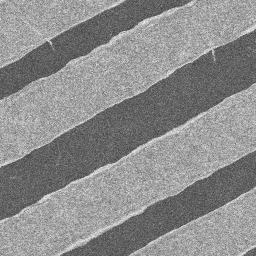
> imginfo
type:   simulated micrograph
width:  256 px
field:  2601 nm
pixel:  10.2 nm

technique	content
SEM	one or a few lines or trenches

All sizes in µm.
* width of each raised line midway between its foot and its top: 0.576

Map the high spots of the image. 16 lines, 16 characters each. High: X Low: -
XXXXXXX----XXXXX
XXXXX----XXXXXXX
XXX----XXXXXXXX-
X----XXXXXXXX---
----XXXXXXX-----
-XXXXXXXX------X
XXXXXXX-------XX
XXXXX-------XXXX
XXXX------XXXXXX
XX------XXXXXXXX
-------XXXXXXX--
----XXXXXXXX----
---XXXXXXX-----X
-XXXXXXX-----XXX
XXXXXX-----XXXXX
XXXX-----XXXXXXX